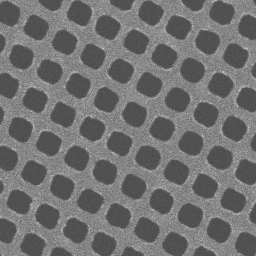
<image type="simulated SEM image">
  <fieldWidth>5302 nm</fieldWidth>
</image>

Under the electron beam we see a regular array of holes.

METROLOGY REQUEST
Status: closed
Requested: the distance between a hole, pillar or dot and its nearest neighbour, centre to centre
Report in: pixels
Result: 31.6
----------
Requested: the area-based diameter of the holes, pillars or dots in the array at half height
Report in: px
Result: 24.9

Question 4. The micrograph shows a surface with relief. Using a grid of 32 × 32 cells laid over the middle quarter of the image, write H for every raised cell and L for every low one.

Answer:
HHHHHLLLLHHHLLLLLHHHHHHHLLLHHLLL
HHHHHHHHHHHLLLLLLLHHHHHHHHHHHLLL
HHLLHHHHHHHLLLLLLHHLLLHHHHHHHLLL
HLLLLLHHHHHHLLLLLHHLLLLLHHHHHHLL
HLLLLLLHHHHHHLLLHHLLLLLLHHHHHHHL
LLLLLLLHHHHHHHHHHHLLLLLLLHHHHHHH
LLLLLLHHLLLLHHHHHHLLLLLLHHLLLLHH
HLLLLLHHLLLLLHHHHHHLLLLLHHLLLLLH
HHHLLHHHLLLLLLHHHHHHHLHHHLLLLLLL
HHHHHHHLLLLLLLHHLHHHHHHHHLLLLLLL
LHHHHHHHLLLLLHHLLLLLHHHHHHLLLLLH
LLLHHHHHHLLLHHHLLLLLLHHHHHHLLLHH
LLLHHHHHHHHHHHLLLLLLLHHHHHHHHHHH
LLLHHLLHHHHHHHHLLLLLLHHLLLHHHHHH
LLHHHLLLLHHHHHHLLLLLHHLLLLLHHHHH
LLHHLLLLLLHHHHHHHLLHHHLLLLLLHHHH
HHHHLLLLLLHHHHHHHHHHHLLLLLLLHHHH
HHHHLLLLLLHHLLLHHHHHHHLLLLLHHHLL
HHHHHLLLLHHLLLLLLHHHHHLLLLLHHLLL
HHHHHHHLHHHLLLLLLHHHHHHHHHHHHLLL
HHLLHHHHHHHLLLLLLHHLLLHHHHHHHLLL
HLLLLHHHHHHLLLLLHHHLLLLHHHHHHLLL
LLLLLLHHHHHHHLLLHHLLLLLLHHHHHHHL
LLLLLLHHHHHHHHHHHHLLLLLLHHHHHHHH
LLLLLLHHLLLLHHHHHHLLLLLLHHLLLHHH
HLLLLLHHLLLLLHHHHHHLLLLHHLLLLLLH
HHHLLHHLLLLLLLHHHHHHHLLHHLLLLLLH
HHHHHHHLLLLLLHHHLHHHHHHHHLLLLLLH
LHHHHHHLLLLLLHHLLLLHHHHHHLLLLLLH
LLHHHHHHHLLLLHLLLLLLHHHHHHHLLLHH
LLLHHHHHHHHHHHLLLLLLLHHHHHHHHHHH
LLLHHLLHHHHHHHLLLLLLHHHLLHHHHHHH